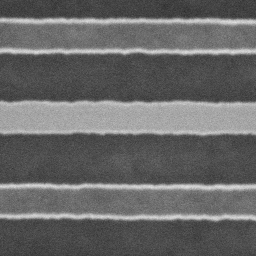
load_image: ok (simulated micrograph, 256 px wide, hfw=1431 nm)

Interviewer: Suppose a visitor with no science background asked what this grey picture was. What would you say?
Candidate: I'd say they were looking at lines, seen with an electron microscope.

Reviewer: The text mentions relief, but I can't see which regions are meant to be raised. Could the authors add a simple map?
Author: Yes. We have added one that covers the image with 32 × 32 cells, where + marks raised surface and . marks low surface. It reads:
................................
................................
++++++++++++++++++++++++++++.+.+
++++++++++++++++++++++++++++++++
++++++++++++++++++++++++++++++++
++++++++++++++++++++++++++++++++
++++++++++++++++++++++++++++++++
................................
................................
................................
................................
................................
................................
++++++++++++++++++++++++++++++++
++++++++++++++++++++++++++++++++
++++++++++++++++++++++++++++++++
++++++++++++++++++++++++++++++++
................................
................................
................................
................................
................................
................................
++++++++++++++++++++++++++++++++
++++++++++++++++++++++++++++++++
++++++++++++++++++++++++++++++++
++++++++++++++++++++++++++++++++
................................
................................
................................
................................
................................